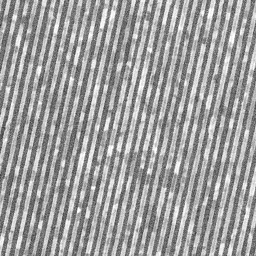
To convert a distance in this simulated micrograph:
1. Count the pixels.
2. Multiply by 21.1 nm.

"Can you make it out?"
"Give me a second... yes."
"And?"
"parallel lines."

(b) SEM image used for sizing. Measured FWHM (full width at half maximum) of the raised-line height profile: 74.8 nanometres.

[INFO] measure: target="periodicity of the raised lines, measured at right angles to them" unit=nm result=184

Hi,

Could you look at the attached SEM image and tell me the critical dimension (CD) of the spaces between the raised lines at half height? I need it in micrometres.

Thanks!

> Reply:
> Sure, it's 0.114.